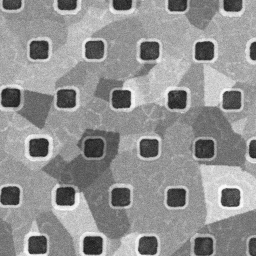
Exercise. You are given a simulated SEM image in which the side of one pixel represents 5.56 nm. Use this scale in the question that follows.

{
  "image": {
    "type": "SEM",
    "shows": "a regular array of holes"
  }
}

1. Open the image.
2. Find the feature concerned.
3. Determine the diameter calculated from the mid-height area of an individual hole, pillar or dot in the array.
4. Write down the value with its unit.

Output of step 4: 128 nm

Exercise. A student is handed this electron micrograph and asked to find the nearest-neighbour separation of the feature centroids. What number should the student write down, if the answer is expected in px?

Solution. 55.1